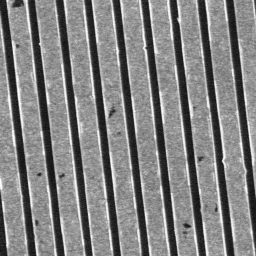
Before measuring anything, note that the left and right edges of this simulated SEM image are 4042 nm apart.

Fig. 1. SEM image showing parallel lines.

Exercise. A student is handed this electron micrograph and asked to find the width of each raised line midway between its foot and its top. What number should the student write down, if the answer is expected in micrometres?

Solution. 0.314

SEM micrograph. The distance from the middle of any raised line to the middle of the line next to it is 444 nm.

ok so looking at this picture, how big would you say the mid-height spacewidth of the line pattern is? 8.44 px